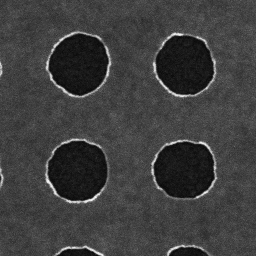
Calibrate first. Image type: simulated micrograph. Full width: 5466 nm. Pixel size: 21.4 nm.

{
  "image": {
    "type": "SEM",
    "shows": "holes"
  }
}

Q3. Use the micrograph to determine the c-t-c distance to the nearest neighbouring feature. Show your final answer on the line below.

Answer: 2250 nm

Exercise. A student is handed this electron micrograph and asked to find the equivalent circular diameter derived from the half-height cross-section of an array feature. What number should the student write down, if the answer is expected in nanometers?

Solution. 1280